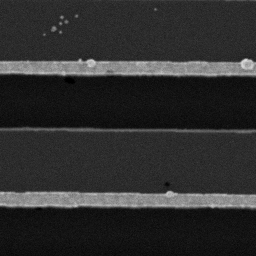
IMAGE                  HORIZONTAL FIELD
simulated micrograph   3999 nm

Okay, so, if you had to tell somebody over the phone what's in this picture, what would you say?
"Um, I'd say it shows lines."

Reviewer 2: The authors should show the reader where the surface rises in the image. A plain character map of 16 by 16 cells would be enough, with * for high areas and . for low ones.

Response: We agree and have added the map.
****************
****************
****************
****************
****************
................
................
................
****************
****************
****************
****************
****************
................
................
................